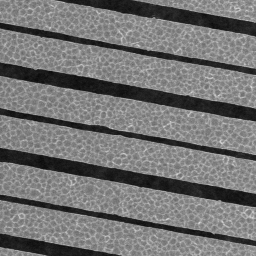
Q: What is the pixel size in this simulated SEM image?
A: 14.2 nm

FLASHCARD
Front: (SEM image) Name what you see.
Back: parallel lines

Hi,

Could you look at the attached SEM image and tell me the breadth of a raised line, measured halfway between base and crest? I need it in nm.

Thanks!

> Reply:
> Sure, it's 445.